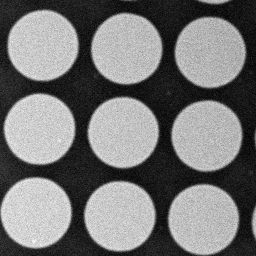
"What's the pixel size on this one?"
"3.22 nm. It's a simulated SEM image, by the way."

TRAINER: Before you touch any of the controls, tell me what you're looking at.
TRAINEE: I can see an array of small figures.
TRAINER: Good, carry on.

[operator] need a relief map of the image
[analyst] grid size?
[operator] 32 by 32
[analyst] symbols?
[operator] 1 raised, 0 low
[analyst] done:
00000000000000000000000000000000
00001110000000000000000000000000
00111111000001111100000001110000
00111111100011111110000111111000
01111111110011111111001111111100
01111111110111111111001111111110
01111111110111111111001111111110
01111111100011111111001111111110
00111111100011111111001111111100
00011111000001111110000111111100
00000000000000000000000011110000
00000000000000000000000000000000
00011110000000111000000000000000
00111111000011111100000111111000
01111111100011111110001111111000
01111111100111111111001111111100
01111111100111111111001111111100
01111111100111111111011111111100
01111111100011111110001111111100
00111111000011111110001111111000
00000000000000111000000111110000
00000000000000000000000000000000
00011100000000000000000000000000
01111111000011111100000011100000
01111111000111111110001111111000
11111111100111111110011111111000
11111111100111111110011111111100
11111111100111111110011111111100
01111111000111111110011111111100
01111111000111111110001111111000
00111100000011111100001111111000
00000000000000000000000011100000